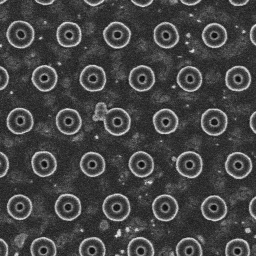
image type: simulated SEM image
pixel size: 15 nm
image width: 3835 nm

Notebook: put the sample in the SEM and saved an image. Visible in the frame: a regular array of ring-shaped raised bodies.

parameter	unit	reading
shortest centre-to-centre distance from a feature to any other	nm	724